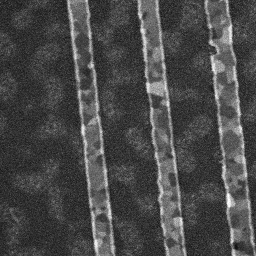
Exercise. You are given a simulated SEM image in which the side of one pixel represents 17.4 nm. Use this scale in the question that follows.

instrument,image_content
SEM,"one or a few lines or trenches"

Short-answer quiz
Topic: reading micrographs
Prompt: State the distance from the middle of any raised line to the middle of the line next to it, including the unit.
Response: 1200 nm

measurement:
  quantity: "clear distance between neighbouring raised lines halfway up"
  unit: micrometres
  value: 0.891